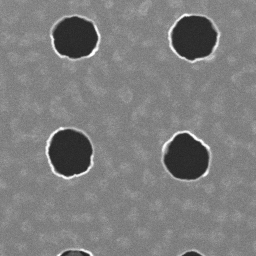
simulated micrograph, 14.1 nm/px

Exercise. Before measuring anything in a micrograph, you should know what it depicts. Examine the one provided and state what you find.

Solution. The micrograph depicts holes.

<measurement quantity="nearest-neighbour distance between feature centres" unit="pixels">116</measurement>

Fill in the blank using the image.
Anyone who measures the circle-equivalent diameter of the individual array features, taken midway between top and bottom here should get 636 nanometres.